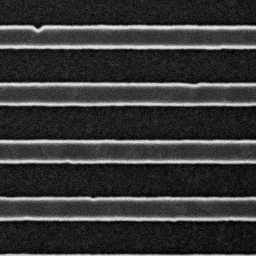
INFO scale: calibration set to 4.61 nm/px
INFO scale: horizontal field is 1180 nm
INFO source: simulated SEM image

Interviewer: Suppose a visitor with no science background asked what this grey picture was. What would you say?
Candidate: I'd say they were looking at parallel lines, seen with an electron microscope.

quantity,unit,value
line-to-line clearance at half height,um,0.167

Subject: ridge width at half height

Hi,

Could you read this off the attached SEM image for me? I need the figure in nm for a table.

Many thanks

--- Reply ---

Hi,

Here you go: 95.1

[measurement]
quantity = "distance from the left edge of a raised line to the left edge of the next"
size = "264 nm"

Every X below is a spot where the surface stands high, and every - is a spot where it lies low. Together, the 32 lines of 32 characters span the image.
--------------------------------
--------------------------------
--------------------------------
XXXX-XXXXXXXXXXXXXXXXXXXXXXXXXXX
XXXXXXXXXXXXXXXXXXXXXXXXXXXXXXXX
XXXXXXXXXXXXXXXXXXXXXXXXXXXXXXXX
--------------------------------
--------------------------------
--------------------------------
--------------------------------
--------------------------------
XXXXXXXXXXXXXXXXXXXXXXXXXXXXXXXX
XXXXXXXXXXXXXXXXXXXXXXXXXXXXXXXX
--------------------------------
--------------------------------
--------------------------------
--------------------------------
--------------------------------
XXXXXXXXXXXXXXXXXXXXXXXXXXXXXXXX
XXXXXXXXXXXXXXXXXXXXXXXXXXXXXXXX
--------------------------------
--------------------------------
--------------------------------
--------------------------------
--------------------------------
XXXXXXXXXXXXXXXXXXXXXXXXXXXXXXXX
XXXXXXXXXXXXXXXXXXXXXXXXXXXXXXXX
--------------------------------
--------------------------------
--------------------------------
--------------------------------
--------------------------------